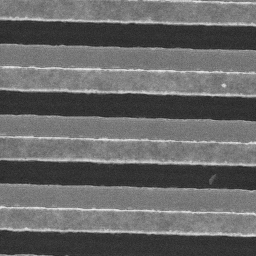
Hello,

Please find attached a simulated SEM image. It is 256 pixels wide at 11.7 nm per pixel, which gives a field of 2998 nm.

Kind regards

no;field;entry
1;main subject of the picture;lines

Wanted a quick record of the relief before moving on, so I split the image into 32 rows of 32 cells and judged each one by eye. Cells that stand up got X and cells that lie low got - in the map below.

XXXXXXXXXXXXXXXXXXXXXXXXXXXXXXXX
XXXXXXXXXXXXXXXXXXXXXXXXXXXXXXXX
-----XXXXXXXXXXXXXXXXXXXXXXXXXXX
--------------------------------
--------------------------------
--------------------------------
XXXXXXXXXXXXXXXXXXXXXXXXXXXXXXXX
XXXXXXXXXXXXXXXXXXXXXXXXXXXXXXXX
XXXXXXXXXXXXXXXXXXXXXXXXXXXXXXXX
XXXXXXXXXXXXXXXXXXXXXXXXXXXXXXXX
XXXXXXXXXXXXXXXXXXXXXXXXXXXXXXXX
----------XXXXXXXXXXXXXXXXXXXXXX
--------------------------------
--------------------------------
XXXXX---------------------------
XXXXXXXXXXXXXXXXXXXXXXXXXXXXXXXX
XXXXXXXXXXXXXXXXXXXXXXXXXXXXXXXX
XXXXXXXXXXXXXXXXXXXXXXXXXXXXXXXX
XXXXXXXXXXXXXXXXXXXXXXXXXXXXXXXX
XXXXXXXXXXXXXXXXXXXXXXXXXXXXXXXX
-----------------------XXXXXXXXX
--------------------------------
--------------------------------
XXXXXXXXXXXXXXXXX---------------
XXXXXXXXXXXXXXXXXXXXXXXXXXXXXXXX
XXXXXXXXXXXXXXXXXXXXXXXXXXXXXXXX
XXXXXXXXXXXXXXXXXXXXXXXXXXXXXXXX
XXXXXXXXXXXXXXXXXXXXXXXXXXXXXXXX
XXXXXXXXXXXXXXXXXXXXXXXXXXXXXXXX
-----------------------------XXX
--------------------------------
--------------------------------